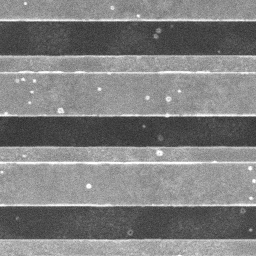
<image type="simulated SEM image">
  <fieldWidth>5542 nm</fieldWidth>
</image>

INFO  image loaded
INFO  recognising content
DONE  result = lines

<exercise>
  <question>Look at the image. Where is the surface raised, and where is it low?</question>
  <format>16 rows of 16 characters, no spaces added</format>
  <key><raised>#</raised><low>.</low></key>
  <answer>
################
................
................
................
################
################
################
................
................
################
################
################
################
................
................
################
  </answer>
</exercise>